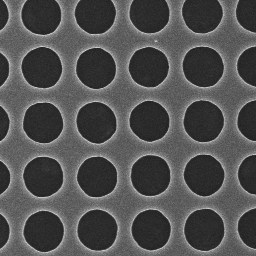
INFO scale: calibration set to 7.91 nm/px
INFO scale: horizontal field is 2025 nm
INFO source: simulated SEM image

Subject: a regular array of holes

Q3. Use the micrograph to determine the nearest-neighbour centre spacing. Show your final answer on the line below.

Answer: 0.422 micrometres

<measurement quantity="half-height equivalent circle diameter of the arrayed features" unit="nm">322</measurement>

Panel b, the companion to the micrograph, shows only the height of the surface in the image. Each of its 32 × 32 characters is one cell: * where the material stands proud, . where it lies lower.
.**....***....**.....**.....**..
.**.....*.....**.....**.....*...
.**.....*.....**.....**.....**..
***....***....***...****...****.
********************************
********************************
****...****..****...****...***..
.**.....**....**.....**.....**..
.**.....**.....*.....**.....**..
.**.....**....**.....**.....**..
****...***....***...****...****.
********************************
********************************
****...***....***....**....***..
.**.....**....**.....**.....**..
.**.....**.....*.....**.....**..
.**.....**....***....**.....**..
****...****..*****..****...****.
********************************
******************.*****..*****.
***....***....***....**.....**..
.**.....**.....*.....**.....**..
.**.....**.....*.....**.....**..
.**.....**....***....***...***..
*****.*****..************.******
********************************
*****.*****..*****..****...****.
.**.....**....***....**.....**..
.**.....**.....**....**.....**..
.**.....**.....**....**.....**..
.***...***....***....***...****.
********************************